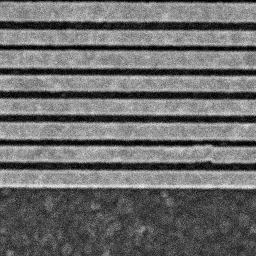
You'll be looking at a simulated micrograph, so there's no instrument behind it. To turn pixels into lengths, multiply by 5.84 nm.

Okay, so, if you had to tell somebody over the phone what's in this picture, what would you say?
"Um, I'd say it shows parallel lines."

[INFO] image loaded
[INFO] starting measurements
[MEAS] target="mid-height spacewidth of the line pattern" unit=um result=0.0569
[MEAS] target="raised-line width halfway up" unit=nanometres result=86.1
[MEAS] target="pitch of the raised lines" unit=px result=23.9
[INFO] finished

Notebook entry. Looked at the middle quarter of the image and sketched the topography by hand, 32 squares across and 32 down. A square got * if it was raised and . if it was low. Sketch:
********************************
................................
................................
********************************
********************************
********************************
.*******************************
................................
................................
********************************
********************************
********************************
.......................**...**..
................................
................................
********************************
********************************
********************************
***********.********************
................................
................................
********************************
********************************
********************************
................................
................................
................................
********************************
********************************
********************************
***.*..*..*..**********...******
................................